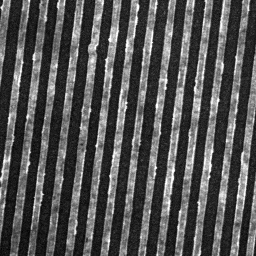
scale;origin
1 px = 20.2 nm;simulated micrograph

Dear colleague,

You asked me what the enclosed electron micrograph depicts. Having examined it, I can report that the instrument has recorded parallel lines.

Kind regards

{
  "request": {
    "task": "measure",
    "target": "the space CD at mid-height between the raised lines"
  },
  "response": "228 nm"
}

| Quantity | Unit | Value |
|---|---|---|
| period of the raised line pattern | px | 18.2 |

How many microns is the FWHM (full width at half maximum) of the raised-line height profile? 0.135